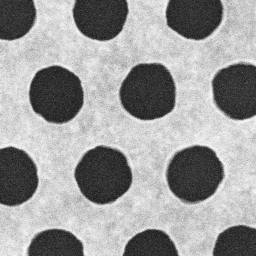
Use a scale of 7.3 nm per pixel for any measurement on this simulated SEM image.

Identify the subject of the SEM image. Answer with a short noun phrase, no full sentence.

holes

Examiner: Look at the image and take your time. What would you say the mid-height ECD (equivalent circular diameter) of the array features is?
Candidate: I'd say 422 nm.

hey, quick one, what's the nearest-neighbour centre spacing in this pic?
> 670 nanometers